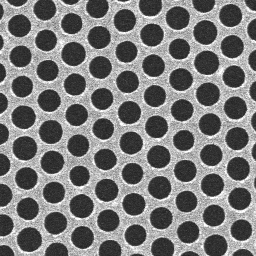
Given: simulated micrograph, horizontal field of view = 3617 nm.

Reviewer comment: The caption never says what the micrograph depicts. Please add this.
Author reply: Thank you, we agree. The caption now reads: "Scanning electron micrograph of a regular array of holes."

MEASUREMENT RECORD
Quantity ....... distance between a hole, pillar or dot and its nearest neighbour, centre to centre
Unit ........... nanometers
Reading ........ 427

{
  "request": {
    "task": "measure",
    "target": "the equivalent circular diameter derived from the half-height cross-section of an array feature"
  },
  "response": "324 nanometers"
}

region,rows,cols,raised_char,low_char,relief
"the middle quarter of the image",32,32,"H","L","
HHLHHHLLLLLLHHHHHHHLLLLLLHHHHHHH
HHHHHHLLLLLLHHHHHHHHLLLLLHHLLLLH
HHLLHHHLLLLHHHLLLLHHLLLLHHLLLLLL
HLLLLHHHLLHHHLLLLLLHHHHHHHLLLLLL
LLLLLHHHHHHHHLLLLLLHHHHHHHLLLLLL
LLLLLLHHHHHHHLLLLLLHHLLLHHHLLLLL
LLLLLHHHLLLHHHLLLLHHLLLLLHHHLLLH
HLLLHHHLLLLLHHHHHHHHLLLLLHHHHHHH
HHHHHHHLLLLLHHHHHHHHLLLLLHHHHHHH
HHHHHHHLLLLLHHHLLLHHLLLLLHHHLLLL
HHLLLHHLLLLLHHLLLLLHHLLLHHHLLLLL
HLLLLLHHHLHHHLLLLLLHHHHHHHHLLLLL
LLLLLLHHHHHHHLLLLLLHHHHHHHHLLLLL
LLLLLLHHHHHHHHLLLLLHHLLLLHHLLLLL
HLLLLHHHLLLLHHHLLLHHLLLLLLHHHHHH
HHLLHHHLLLLLHHHHHHHHLLLLLLHHHHHH
HHHHHHHLLLLLLHHHHHHHLLLLLLHHHHLH
HHHHHHHLLLLLHHHLLLLHHLLLLHHHLLLL
HHLLLLHHLLLHHHLLLLLHHHHLHHHLLLLL
HLLLLLHHHHHHHHLLLLLLHHHHHHHLLLLL
HLLLLLHHHHHHHHLLLLLLHHHLLHHHLLLL
HLLLLLHHHLLLHHLLLLLHHLLLLLHHHLLH
HHLLLHHHLLLLLHHHLLHHHLLLLLLHHHHH
HHHHHHHLLLLLLHHHHHHHHLLLLLLHHHHH
HHHHHHHHLLLLLHHHHHHHHLLLLLHHHLLL
HHHLLHHHLLLLLHHLLLLHHHLLLHHHLLLL
HHLLLLHHHLLHHHLLLLLLHHHHHHHLLLLL
HLLLLLHHHHHHHHLLLLLLHHHHHHHLLLLL
HLLLLLHHHHHHHHHLLLLLHHLLLLHHLLLL
HHLLLLHHLLLLLHHLLLLHHLLLLLHHHHLH
HHHLHHHHLLLLLHHHHHHHHLLLLLLHHHHH
HHHHHHHHLLLLLLHHHHHHHLLLLLLHHHHH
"